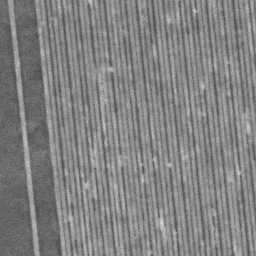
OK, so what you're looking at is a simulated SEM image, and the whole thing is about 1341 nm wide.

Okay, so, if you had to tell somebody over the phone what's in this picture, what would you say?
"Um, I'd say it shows parallel lines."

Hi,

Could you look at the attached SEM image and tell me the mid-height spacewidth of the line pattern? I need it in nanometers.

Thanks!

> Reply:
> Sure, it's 10.4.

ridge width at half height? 15.6 nm